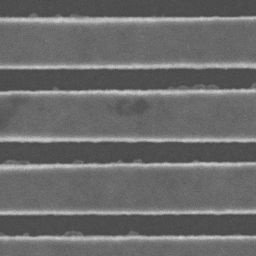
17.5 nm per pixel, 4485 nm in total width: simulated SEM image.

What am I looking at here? lines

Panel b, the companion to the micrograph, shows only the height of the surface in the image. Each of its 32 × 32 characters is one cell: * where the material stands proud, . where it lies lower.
................................
................................
********************************
********************************
********************************
********************************
********************************
********************************
*********.*..**.................
................................
................................
.***.***************************
********************************
********************************
********************************
********************************
********************************
********************************
................................
................................
..............******************
********************************
********************************
********************************
********************************
********************************
********************************
................................
................................
*....**.........**..***.********
********************************
********************************